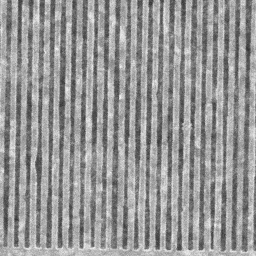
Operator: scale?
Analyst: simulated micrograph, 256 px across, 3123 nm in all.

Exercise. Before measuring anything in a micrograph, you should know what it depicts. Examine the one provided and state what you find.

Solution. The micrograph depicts parallel lines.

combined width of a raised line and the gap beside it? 133 nanometres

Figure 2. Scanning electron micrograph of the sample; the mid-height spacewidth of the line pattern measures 74.7 nm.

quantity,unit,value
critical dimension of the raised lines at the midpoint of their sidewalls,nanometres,64